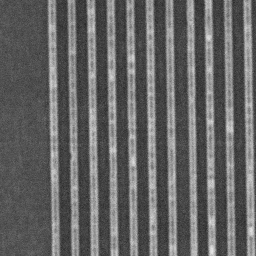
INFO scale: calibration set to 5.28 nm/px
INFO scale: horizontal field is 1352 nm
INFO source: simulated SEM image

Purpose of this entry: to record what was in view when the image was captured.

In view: parallel lines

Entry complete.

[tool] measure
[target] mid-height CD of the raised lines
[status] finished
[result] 32.3 nm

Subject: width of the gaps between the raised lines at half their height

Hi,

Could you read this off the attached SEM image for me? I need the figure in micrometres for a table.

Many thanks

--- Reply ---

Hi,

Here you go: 0.0693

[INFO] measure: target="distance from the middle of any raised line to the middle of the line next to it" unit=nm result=103